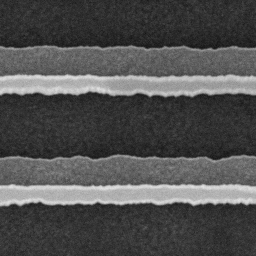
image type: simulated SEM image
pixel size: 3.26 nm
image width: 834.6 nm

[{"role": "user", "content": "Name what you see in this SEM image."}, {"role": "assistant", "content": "lines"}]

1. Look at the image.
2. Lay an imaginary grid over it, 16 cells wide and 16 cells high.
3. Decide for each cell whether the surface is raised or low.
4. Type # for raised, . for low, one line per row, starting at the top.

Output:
................
................
................
################
################
################
................
................
................
................
################
################
################
................
................
................